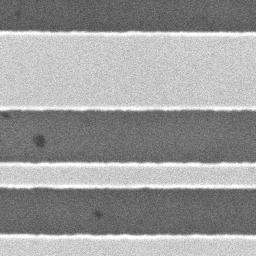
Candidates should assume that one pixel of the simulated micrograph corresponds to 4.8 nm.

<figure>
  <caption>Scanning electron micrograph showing lines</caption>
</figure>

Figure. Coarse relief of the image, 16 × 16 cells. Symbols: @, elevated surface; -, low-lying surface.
----------------
----------------
@@@@@@@@@@@@@@@@
@@@@@@@@@@@@@@@@
@@@@@@@@@@@@@@@@
@@@@@@@@@@@@@@@@
@@@@@@@@@@@@@@@@
----------------
----------------
----------------
@@@@@@@@@@@@@@@@
@@@@@@@@@@@@@@@@
----------------
----------------
----------------
@@@@@@@@@@@@@@@@